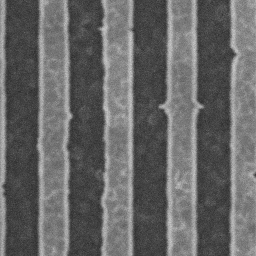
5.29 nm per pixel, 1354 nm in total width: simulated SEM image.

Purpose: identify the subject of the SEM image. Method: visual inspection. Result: one or a few lines or trenches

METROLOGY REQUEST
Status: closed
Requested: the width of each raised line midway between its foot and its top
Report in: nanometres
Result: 130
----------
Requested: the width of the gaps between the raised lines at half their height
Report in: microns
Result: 0.206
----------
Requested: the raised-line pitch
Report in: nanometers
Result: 338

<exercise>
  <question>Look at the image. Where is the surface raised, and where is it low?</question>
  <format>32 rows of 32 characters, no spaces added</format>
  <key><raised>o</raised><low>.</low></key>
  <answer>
.....ooo.....ooo.....ooo.....ooo
.....ooo.....ooo.....ooo.....ooo
.....ooo.....ooo.....ooo.....ooo
.....ooo.....ooo.....ooo.....ooo
.....ooo.....ooo.....ooo.....ooo
.....ooo.....ooo.....ooo.....ooo
.....ooo.....ooo.....ooo......oo
.....ooo.....ooo.....ooo.....ooo
.....ooo.....ooo.....ooo.....ooo
.....ooo.....ooo.....ooo.....ooo
.....ooo.....ooo.....ooo.....ooo
.....ooo.....ooo.....ooo.....ooo
.....ooo.....ooo.....ooo.....ooo
.....ooo.....ooo.....oooo....ooo
.....oooo....ooo.....ooo.....ooo
.....ooo.....ooo.....ooo.....ooo
.....ooo.....ooo.....ooo.....ooo
.....ooo.....ooo.....ooo.....ooo
.....ooo.....ooo.....ooo.....ooo
.....ooo.....ooo.....ooo.....ooo
.....ooo.....ooo.....ooo.....ooo
.....ooo.....ooo.....ooo.....ooo
.....ooo.....ooo.....ooo.....ooo
.....ooo.....ooo.....ooo.....ooo
.....ooo.....ooo.....ooo.....ooo
.....ooo.....ooo.....ooo.....ooo
.....ooo.....ooo.....ooo.....ooo
.....ooo.....ooo.....ooo.....ooo
.....ooo.....ooo.....ooo.....ooo
.....ooo.....ooo.....ooo.....ooo
.....ooo.....ooo.....ooo.....ooo
.....ooo.....ooo.....ooo.....ooo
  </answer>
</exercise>